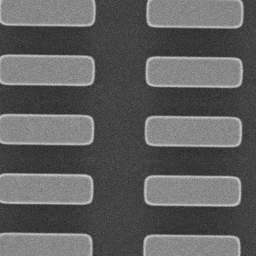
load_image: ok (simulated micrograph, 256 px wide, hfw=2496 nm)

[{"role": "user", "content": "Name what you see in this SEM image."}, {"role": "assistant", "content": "groups of lines, slits or small figures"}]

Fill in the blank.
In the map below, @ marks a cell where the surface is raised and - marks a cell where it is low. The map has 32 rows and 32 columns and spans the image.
@@@@@@@@@@@@------@@@@@@@@@@@@--
@@@@@@@@@@@@------@@@@@@@@@@@@--
@@@@@@@@@@@@------@@@@@@@@@@@@--
--------------------------------
--------------------------------
--------------------------------
--------------------------------
@@@@@@@@@@@@-------@@@@@@@@@@@--
@@@@@@@@@@@@------@@@@@@@@@@@@--
@@@@@@@@@@@@------@@@@@@@@@@@@--
-@@@@@@@@@@--------@@@@@@@@@@@--
--------------------------------
--------------------------------
--------------------------------
@@@@@@@@@@@---------------------
@@@@@@@@@@@@------@@@@@@@@@@@@--
@@@@@@@@@@@@------@@@@@@@@@@@@--
@@@@@@@@@@@@------@@@@@@@@@@@@--
--------------------------------
--------------------------------
--------------------------------
--------------------------------
@@@@@@@@@@@-------@@@@@@@@@@@@--
@@@@@@@@@@@@------@@@@@@@@@@@@--
@@@@@@@@@@@@------@@@@@@@@@@@@--
-------------------@@@@@@@@@@@--
--------------------------------
--------------------------------
--------------------------------
@@@@@@@@@@@--------@@@@@@@@@@---
@@@@@@@@@@@-------@@@@@@@@@@@@--
@@@@@@@@@@@-------@@@@@@@@@@@@--